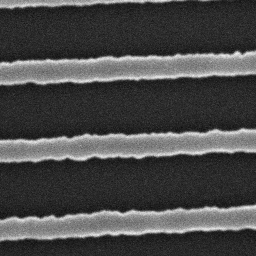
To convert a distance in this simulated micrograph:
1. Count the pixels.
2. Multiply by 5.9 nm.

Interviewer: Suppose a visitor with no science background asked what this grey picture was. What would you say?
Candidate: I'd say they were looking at lines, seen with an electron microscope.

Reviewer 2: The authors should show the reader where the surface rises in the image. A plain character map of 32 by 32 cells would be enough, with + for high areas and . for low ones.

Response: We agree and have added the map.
++++++++++++....................
................................
................................
................................
................................
................................
...............................+
...........+++++++++++++++++++++
++++++++++++++++++++++++++++++++
++++++++++++++++++++++++++......
++..............................
................................
................................
................................
................................
................................
..........................++++++
..+..+++++++++++++++++++++++++++
++++++++++++++++++++++++++++++++
++++++++++++++++++++............
................................
................................
................................
................................
................................
................................
............+++.++++++++++++++++
++++++++++++++++++++++++++++++++
++++++++++++++++++++++++++++++++
++++++++++++....................
................................
................................